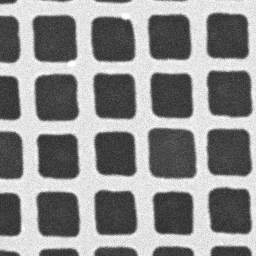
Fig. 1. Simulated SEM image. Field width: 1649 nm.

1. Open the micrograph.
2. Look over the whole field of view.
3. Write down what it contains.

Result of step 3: a regular array of holes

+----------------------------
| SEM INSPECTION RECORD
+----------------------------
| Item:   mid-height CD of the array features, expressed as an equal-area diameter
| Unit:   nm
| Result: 316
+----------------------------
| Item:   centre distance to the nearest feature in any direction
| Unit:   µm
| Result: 0.368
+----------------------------